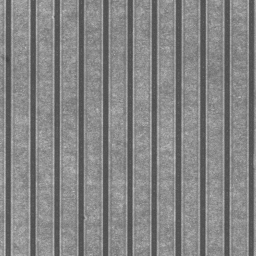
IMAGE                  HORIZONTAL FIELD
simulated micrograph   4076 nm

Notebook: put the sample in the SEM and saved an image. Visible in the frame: parallel lines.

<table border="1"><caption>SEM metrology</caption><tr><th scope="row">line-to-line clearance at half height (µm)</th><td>0.103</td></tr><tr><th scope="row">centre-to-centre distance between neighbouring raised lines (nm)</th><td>387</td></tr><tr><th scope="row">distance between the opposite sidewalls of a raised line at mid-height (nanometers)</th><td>279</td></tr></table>